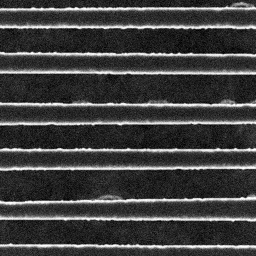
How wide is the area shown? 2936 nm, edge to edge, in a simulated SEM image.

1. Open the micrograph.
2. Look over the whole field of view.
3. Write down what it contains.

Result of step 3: lines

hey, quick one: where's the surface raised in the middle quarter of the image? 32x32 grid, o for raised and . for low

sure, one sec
oooooooooooooooooooooooooooooooo
oooooooooooooooooooooooooooooooo
................................
................................
................................
................................
................................
................................
................................
................................
oooooooooooooooooooooooooooooooo
oooooooooooooooooooooooooooooooo
oooooooooooooooooooooooooooooooo
oooooooooooooooooooooooooooooooo
oooooooooooooooooooooooooooooooo
................................
................................
................................
................................
................................
................................
oooooooooooooooooooooooooooooooo
oooooooooooooooooooooooooooooooo
oooooooooooooooooooooooooooooooo
oooooooooooooooooooooooooooooooo
oooooooooooooooooooooooooooooooo
................................
................................
................................
................................
................................
................................